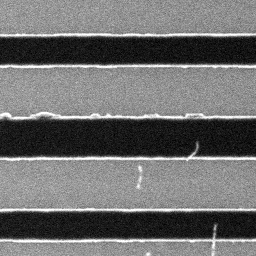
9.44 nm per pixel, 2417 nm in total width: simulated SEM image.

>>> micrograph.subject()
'lines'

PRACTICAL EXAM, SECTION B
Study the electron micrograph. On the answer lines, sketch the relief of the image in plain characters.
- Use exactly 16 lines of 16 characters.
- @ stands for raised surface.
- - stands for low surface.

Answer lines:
----------------
----------------
@@@@@@@@@@@@@@@@
@@@@@@@@@@@@@@@@
----------------
----------------
----------------
@@@@@@@@@@@@@@@@
@@@@@@@@@@@@@@@@
@@@@@@@@@@@@@@@@
----------------
----------------
----------------
@@@@@@@@@@@@@@@@
@@@@@@@@@@@@@@@@
----------------